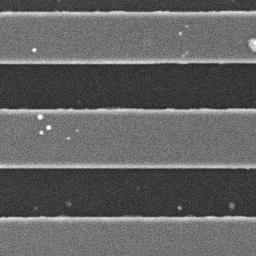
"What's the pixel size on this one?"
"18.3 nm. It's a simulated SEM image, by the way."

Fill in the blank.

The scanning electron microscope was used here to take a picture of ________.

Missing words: lines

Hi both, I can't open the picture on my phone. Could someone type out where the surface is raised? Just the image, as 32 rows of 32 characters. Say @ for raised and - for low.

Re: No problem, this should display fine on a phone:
--------------------------------
-------@----@@@@---@@@----@@@@@@
@@@@@@@@@@@@@@@@@@@@@@@@@@@@@@@@
@@@@@@@@@@@@@@@@@@@@@@@@@@@@@@@@
@@@@@@@@@@@@@@@@@@@@@@@@@@@@@@@@
@@@@@@@@@@@@@@@@@@@@@@@@@@@@@@@@
@@@@@@@@@@@@@@@@@@@@@@@@@@@@@@@@
@@@@@@@@@@@@@@@@@@@@@@@@@@@@@@@@
--------------------------------
--------------------------------
--------------------------------
--------------------------------
--------------------------------
--------------------------------
@@@@@@@@@@@@@@@@@@@@@@@@@@@@@@@@
@@@@@@@@@@@@@@@@@@@@@@@@@@@@@@@@
@@@@@@@@@@@@@@@@@@@@@@@@@@@@@@@@
@@@@@@@@@@@@@@@@@@@@@@@@@@@@@@@@
@@@@@@@@@@@@@@@@@@@@@@@@@@@@@@@@
@@@@@@@@@@@@@@@@@@@@@@@@@@@@@@@@
@@@@@@@@@@@@@@@@@@@@@@@@@@@@@@@@
--------------------------------
--------------------------------
--------------------------------
--------------------------------
--------------------------------
--------------------------------
@@@@@@@@@@@@@@@@@@@@@@@@@@@@@@@@
@@@@@@@@@@@@@@@@@@@@@@@@@@@@@@@@
@@@@@@@@@@@@@@@@@@@@@@@@@@@@@@@@
@@@@@@@@@@@@@@@@@@@@@@@@@@@@@@@@
@@@@@@@@@@@@@@@@@@@@@@@@@@@@@@@@